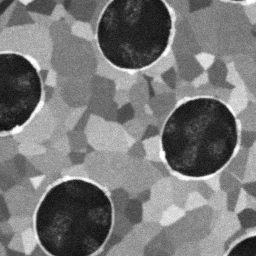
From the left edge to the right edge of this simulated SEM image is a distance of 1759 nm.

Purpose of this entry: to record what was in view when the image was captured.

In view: holes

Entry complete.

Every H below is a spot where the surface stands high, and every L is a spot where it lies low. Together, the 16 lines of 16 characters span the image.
HHHHHHHLLLLHHHHH
HHHHHHLLLLLHHHHH
HHHHHHLLLLLHHHHH
LHHHHHHLLLHHHHHH
LLHHHHHHHHHHHHHH
LLLHHHHHHHHHHHHH
LLHHHHHHHHHLLLHH
LLHHHHHHHHLLLLLH
HHHHHHHHHHLLLLLH
HHHHHHHHHHLLLLLH
HHHHHHHHHHHLLLHH
HHHHLLHHHHHHHHHH
HHHLLLLHHHHHHHHH
HHLLLLLHHHHHHHHH
HHLLLLLHHHHHHHHH
HHHLLLHHHHHHHHHL